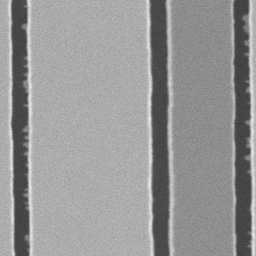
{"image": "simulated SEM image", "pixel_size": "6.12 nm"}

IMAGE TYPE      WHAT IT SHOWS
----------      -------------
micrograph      lines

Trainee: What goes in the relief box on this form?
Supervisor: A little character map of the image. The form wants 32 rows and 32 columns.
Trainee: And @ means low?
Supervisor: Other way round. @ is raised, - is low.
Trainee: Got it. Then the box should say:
@--@@@@@@@@@@@@@@@@--@@@@@@@@--@
@---@@@@@@@@@@@@@@@--@@@@@@@@--@
@---@@@@@@@@@@@@@@@--@@@@@@@@--@
@--@@@@@@@@@@@@@@@@--@@@@@@@@--@
@--@@@@@@@@@@@@@@@@--@@@@@@@@--@
@--@@@@@@@@@@@@@@@@--@@@@@@@@--@
@--@@@@@@@@@@@@@@@@--@@@@@@@@--@
@---@@@@@@@@@@@@@@@--@@@@@@@@--@
@---@@@@@@@@@@@@@@@--@@@@@@@@--@
@---@@@@@@@@@@@@@@@--@@@@@@@@--@
@@--@@@@@@@@@@@@@@@--@@@@@@@@--@
@---@@@@@@@@@@@@@@@--@@@@@@@@--@
@---@@@@@@@@@@@@@@@--@@@@@@@@--@
@---@@@@@@@@@@@@@@@--@@@@@@@@--@
@---@@@@@@@@@@@@@@@--@@@@@@@@--@
@---@@@@@@@@@@@@@@@--@@@@@@@@--@
@---@@@@@@@@@@@@@@@--@@@@@@@@--@
@@--@@@@@@@@@@@@@@@--@@@@@@@@--@
@@--@@@@@@@@@@@@@@@--@@@@@@@@--@
@@--@@@@@@@@@@@@@@@--@@@@@@@@--@
@@--@@@@@@@@@@@@@@@--@@@@@@@@--@
@@--@@@@@@@@@@@@@@@--@@@@@@@@--@
@@--@@@@@@@@@@@@@@@--@@@@@@@@--@
@@--@@@@@@@@@@@@@@@--@@@@@@@@---
@@--@@@@@@@@@@@@@@@--@@@@@@@@---
@@--@@@@@@@@@@@@@@@--@@@@@@@@--@
@@--@@@@@@@@@@@@@@@--@@@@@@@@--@
@@--@@@@@@@@@@@@@@@--@@@@@@@@---
@@--@@@@@@@@@@@@@@@--@@@@@@@@---
@@--@@@@@@@@@@@@@@@--@@@@@@@@---
@@--@@@@@@@@@@@@@@@--@@@@@@@@---
@@--@@@@@@@@@@@@@@@--@@@@@@@@---